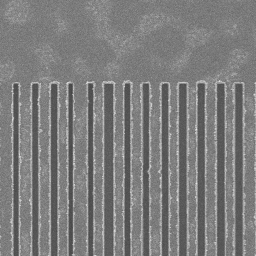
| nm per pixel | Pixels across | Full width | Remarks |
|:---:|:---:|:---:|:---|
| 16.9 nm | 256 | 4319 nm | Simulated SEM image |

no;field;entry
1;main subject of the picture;parallel lines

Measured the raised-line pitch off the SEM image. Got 313 nanometres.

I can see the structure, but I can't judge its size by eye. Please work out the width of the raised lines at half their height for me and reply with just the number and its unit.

186 nanometers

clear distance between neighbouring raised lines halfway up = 114 nanometers